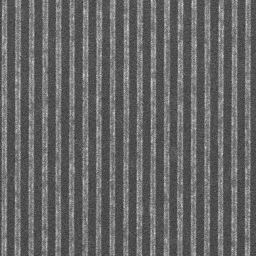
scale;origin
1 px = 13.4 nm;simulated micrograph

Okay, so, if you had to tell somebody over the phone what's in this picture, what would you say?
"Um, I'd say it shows parallel lines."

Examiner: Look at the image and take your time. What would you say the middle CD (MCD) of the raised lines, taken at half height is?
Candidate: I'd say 0.0602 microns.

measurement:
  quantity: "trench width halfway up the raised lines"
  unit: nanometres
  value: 119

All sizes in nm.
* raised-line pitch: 181